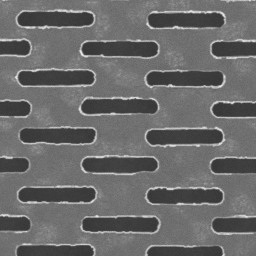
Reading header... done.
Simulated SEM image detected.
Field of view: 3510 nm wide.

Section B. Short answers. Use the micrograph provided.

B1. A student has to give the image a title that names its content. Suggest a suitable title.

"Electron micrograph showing a regular array of holes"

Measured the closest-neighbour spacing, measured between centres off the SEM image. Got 799 nanometres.